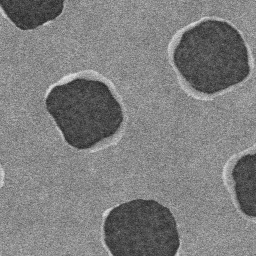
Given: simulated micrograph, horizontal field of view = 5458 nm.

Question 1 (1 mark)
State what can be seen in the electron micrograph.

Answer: holes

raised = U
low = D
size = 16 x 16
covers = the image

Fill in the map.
DDDDUUUUUUUUUUUU
UDDUUUUUUUUUDDUU
UUUUUUUUUUUDDDDU
UUUUUUUUUUUDDDDD
UUUUUUUUUUUDDDDD
UUUDDDDUUUUUDDDU
UUUDDDDDUUUUUUUU
UUUDDDDDUUUUUUUU
UUUUDDDUUUUUUUUU
UUUUUUUUUUUUUUUD
UUUUUUUUUUUUUUDD
UUUUUUUUUUUUUUDD
UUUUUUUUDUUUUUUD
UUUUUUUDDDDUUUUD
UUUUUUDDDDDUUUUU
UUUUUUUDDDDUUUUU